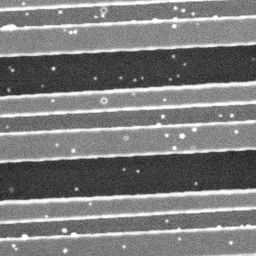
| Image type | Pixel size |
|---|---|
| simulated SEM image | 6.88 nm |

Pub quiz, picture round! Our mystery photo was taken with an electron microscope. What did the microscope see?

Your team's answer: lines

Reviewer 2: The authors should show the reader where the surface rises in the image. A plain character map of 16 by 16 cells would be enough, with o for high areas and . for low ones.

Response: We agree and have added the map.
oooooooooooooooo
oooooooooooooooo
oooooooooooooooo
................
................
..........oooooo
oooooooooooooooo
oooooooooooooooo
oooooooooooooooo
oooooooooooo....
................
................
...ooooooooooooo
oooooooooooooooo
oooooooooooooooo
oooooooooooooooo